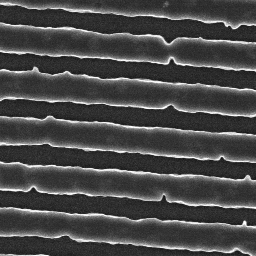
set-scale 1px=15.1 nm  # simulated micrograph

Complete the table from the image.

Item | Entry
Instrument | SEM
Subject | parallel lines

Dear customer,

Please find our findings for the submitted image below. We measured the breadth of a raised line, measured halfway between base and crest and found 413 nm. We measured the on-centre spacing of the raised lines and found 692 nm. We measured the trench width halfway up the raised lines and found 281 nm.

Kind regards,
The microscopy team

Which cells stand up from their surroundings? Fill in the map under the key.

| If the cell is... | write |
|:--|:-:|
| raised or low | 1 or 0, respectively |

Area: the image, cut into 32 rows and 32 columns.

01111111111111111111111111111111
00000000000111111111111111111111
00000000000000000000000001111111
11111110000000000000000000000000
11111111111111111110000000000000
11111111111111111111111111111111
11111111111111111111111111111111
00000000000000011111101111111111
00000000000000000000000000001111
11111111111000000000000000000000
11111111111111111111110110000000
11111111111111111111111111111111
00001111111111111111111111111111
00000000000000000011001111111111
00000000000000000000000000000001
11111111111111000000000000000000
11111111111111111111111111000000
11111111111111111111111111111111
00000000011111111111111111111111
00000000000000000000011111111111
11100000000000000000000000000000
11111111111111111000000000000000
11111111111111111111111111111111
11111111111111111111111111111111
00000000000001111111111111111111
00000000000000000000000111111111
11111110000000000000000000000000
11111111111111111111000000000000
11111111111111111111111111111111
01101111111111111111111111111111
00000000000000011111111111111111
00000000000000000000000000001011